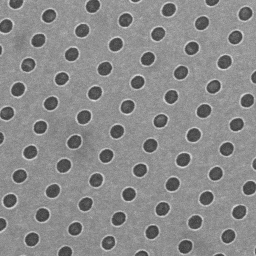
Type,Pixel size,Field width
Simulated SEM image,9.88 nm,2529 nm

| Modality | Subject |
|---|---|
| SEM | a regular array of holes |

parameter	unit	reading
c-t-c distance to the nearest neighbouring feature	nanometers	260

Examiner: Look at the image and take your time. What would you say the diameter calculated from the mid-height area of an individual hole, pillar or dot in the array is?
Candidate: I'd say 143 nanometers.